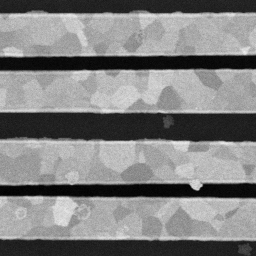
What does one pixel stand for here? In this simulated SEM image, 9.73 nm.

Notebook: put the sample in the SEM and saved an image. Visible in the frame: lines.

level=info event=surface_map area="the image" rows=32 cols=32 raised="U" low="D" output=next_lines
DDDDDDDDDDDDDDDDDDDDDDDDDDDDDDDD
DDDDDDDDDDDDDDDDDDDDDDDDDDDDDDDD
UUUUUUUUUUUUUUUUUUUUUUUUUUUUUUUU
UUUUUUUUUUUUUUUUUUUUUUUUUUUUUUUU
UUUUUUUUUUUUUUUUUUUUUUUUUUUUUUUU
UUUUUUUUUUUUUUUUUUUUUUUUUUUUUUUU
UUUUUUUUUUUUUUUUUUUUUUUUUUUUUUUU
DDDDDDDDDDDDDDDDDDDDDDDDDDDDDDDD
DDDDDDDDDDDDDDDDDDDDDDDDDDDDDDDD
UUUUUUUUUUUUUUUUUUUUUUUUUUUUUUUU
UUUUUUUUUUUUUUUUUUUUUUUUUUUUUUUU
UUUUUUUUUUUUUUUUUUUUUUUUUUUUUUUU
UUUUUUUUUUUUUUUUUUUUUUUUUUUUUUUU
UUUUUUUUUUUUUUUUUUUUUUUUUUUUUUUU
DDDDDDDDDDDDDDDDDDDDDDDDDDDDDDDD
DDDDDDDDDDDDDDDDDDDDDDDDDDDDDDDD
DDDDDDDDDDDDDDDDDDDDDDDDDDDDDDDD
DDDDDDDDDDDDDDDDDDDDDDDDDDDDDDDD
UUUUUUUUUUUUUUUUUUUUUUUUUUUUUUUU
UUUUUUUUUUUUUUUUUUUUUUUUUUUUUUUU
UUUUUUUUUUUUUUUUUUUUUUUUUUUUUUUU
UUUUUUUUUUUUUUUUUUUUUUUUUUUUUUUU
UUUUUUUUUUUUUUUUUUUUUUUUUUUUUUUU
DDDDDDDDDDDDDDDDDDDDDDDDUDDDDDDD
DDDDDDDDDDDDDDDDDDDDDDDDDDDDDDDD
UUUUUUUUUUUUUUUUUUUUUUUUUUUUUUUU
UUUUUUUUUUUUUUUUUUUUUUUUUUUUUUUU
UUUUUUUUUUUUUUUUUUUUUUUUUUUUUUUU
UUUUUUUUUUUUUUUUUUUUUUUUUUUUUUUU
UUUUUUUUUUUUUUUUUUUUUUUUUUUUUUUU
DDDDDDDDDDDDDDDDDDDDDDDDDDDDDDDD
DDDDDDDDDDDDDDDDDDDDDDDDDDDDDDDD